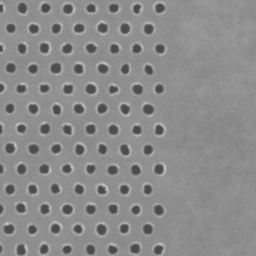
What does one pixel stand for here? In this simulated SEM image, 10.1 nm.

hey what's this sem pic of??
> a regular array of holes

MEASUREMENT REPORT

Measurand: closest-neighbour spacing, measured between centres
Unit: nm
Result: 226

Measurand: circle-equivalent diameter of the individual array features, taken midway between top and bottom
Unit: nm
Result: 99.3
